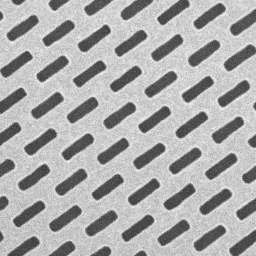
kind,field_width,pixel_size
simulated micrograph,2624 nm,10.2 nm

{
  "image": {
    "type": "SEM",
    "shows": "a regular array of holes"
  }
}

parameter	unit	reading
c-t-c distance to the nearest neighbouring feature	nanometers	369